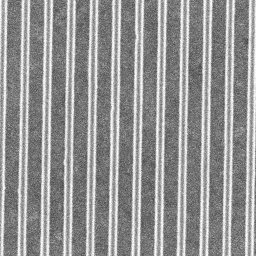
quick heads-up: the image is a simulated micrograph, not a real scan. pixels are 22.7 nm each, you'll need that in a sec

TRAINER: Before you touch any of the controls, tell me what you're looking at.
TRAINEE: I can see parallel lines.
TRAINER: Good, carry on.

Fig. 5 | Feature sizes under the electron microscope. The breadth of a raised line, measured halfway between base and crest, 168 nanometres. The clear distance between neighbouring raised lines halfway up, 15.9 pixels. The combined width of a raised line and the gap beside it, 516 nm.